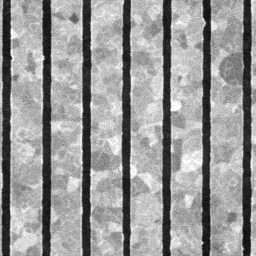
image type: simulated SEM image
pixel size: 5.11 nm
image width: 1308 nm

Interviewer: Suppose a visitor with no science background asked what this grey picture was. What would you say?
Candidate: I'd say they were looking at parallel lines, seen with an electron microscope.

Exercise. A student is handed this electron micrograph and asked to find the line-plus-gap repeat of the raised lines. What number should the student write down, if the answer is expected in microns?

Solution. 0.204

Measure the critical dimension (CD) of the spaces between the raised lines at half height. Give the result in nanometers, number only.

46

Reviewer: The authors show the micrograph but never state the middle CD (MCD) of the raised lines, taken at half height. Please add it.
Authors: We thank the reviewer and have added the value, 158 nanometres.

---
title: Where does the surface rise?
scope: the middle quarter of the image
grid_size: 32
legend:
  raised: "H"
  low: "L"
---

HHHHLLLHHHHHHHLLLHHHHHHHLLLHHHHH
HHHHLLLHHHHHHHLLLHHHHHHHLLLHHHHH
HHHHLLLHHHHHHHLLLHHHHHHHLLLHHHHH
HHHHLLLHHHHHHHLLLHHHHHHHHLLHHHHH
HHHHLLLHHHHHHHLLLHHHHHHHHLLHHHHH
HHHHLLLHHHHHHHHLLHHHHHHHHLLHHHHH
HHHHLLLHHHHHHHLLLHHHHHHHLLLHHHHH
HHHHLLLHHHHHHHLLLHHHHHHHLLLHHHHH
HHHHLLLHHHHHHHLLLHHHHHHHLLLHHHHH
HHHHLLLHHHHHHHLLLHHHHHHHLLLHHHHH
HHHHLLLHHHHHHHLLLHHHHHHHLLLHHHHH
HHHHLLLHHHHHHHLLLHHHHHHHLLLHHHHH
HHHHLLLHHHHHHHLLLHHHHHHHHLLHHHHH
HHHHLLLHHHHHHHLLLHHHHHHHLLLHHHHH
HHHHLLLHHHHHHHHLLHHHHHHHLLLHHHHH
HHHHLLLHHHHHHHLLLHHHHHHHLLLHHHHH
HHHHLLLHHHHHHHLLLHHHHHHHLLLHHHHH
HHHHLLLHHHHHHHLLLHHHHHHHLLLHHHHH
HHHHLLLHHHHHHHLLLHHHHHHHLLLHHHHH
HHHHLLLHHHHHHHLLLHHHHHHHLLLHHHHH
HHHHLLLHHHHHHHLLLHHHHHHHLLLHHHHH
HHHHLLLHHHHHHHLLLHHHHHHHLLLHHHHH
HHHHLLLHHHHHHHLLLHHHHHHHLLLHHHHH
HHHHLLLHHHHHHHLLLHHHHHHHLLLHHHHH
HHHHLLLHHHHHHHLLLHHHHHHHLLLHHHHH
HHHHLLLHHHHHHHLLLHHHHHHHLLLHHHHH
HHHHLLLHHHHHHHLLLHHHHHHHLLLHHHHH
HHHHLLLHHHHHHHLLLHHHHHHHLLLHHHHH
HHHHLLLHHHHHHHLLLHHHHHHHLLLHHHHH
HHHHLLLHHHHHHHLLLHHHHHHHLLLHHHHH
HHHHLLLHHHHHHHLLLHHHHHHHLLLHHHHH
HHHHLLLHHHHHHHLLLHHHHHHHLLLHHHHH